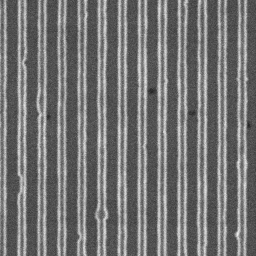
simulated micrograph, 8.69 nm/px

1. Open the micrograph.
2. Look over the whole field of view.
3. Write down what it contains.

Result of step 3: parallel lines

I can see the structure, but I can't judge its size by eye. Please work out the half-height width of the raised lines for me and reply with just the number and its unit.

0.0521 micrometres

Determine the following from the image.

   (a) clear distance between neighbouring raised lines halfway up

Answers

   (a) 122 nm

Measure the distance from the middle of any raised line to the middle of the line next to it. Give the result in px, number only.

20